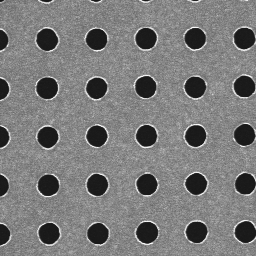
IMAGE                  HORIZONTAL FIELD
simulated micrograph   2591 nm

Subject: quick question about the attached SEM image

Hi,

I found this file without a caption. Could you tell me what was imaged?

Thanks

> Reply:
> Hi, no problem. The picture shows a regular array of holes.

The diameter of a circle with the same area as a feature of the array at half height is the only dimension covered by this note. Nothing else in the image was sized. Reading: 217 nanometres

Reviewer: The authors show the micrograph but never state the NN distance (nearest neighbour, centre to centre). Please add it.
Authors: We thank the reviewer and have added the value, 489 nm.